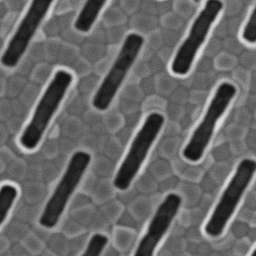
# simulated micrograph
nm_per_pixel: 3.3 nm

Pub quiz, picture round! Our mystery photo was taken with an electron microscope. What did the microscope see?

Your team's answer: holes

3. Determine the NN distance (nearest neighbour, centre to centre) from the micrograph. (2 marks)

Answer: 268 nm